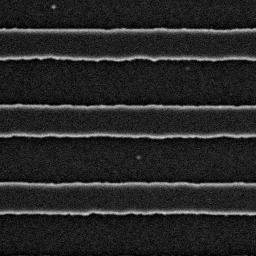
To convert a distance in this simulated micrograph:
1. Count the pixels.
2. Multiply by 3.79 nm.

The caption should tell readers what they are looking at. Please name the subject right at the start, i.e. lines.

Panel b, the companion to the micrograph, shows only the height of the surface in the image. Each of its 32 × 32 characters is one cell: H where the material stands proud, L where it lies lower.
LLLLLLLLLLLLLLLLLLLLLLLLLLLLLLLL
LLLLLLLLLLLLLLLLLLLLLLLLLLLLLLLL
LLLLLLLLLLLLLLLLLLLLLLLLLLLLLLLL
LLLLLLLLLLLLLLLLLLLLLLLLLLLLLLLL
HHHHHHHHHHHHHHHHHHHHHHHHHHHHHHHH
HHHHHHHHHHHHHHHHHHHHHHHHHHHHHHHH
HHHHHHHHHHHHHHHHHHHHHHHHHHHHHHHH
LLLLLLLLLLLLHLHLLLLHLLLLLLHLLLLL
LLLLLLLLLLLLLLLLLLLLLLLLLLLLLLLL
LLLLLLLLLLLLLLLLLLLLLLLLLLLLLLLL
LLLLLLLLLLLLLLLLLLLLLLLLLLLLLLLL
LLLLLLLLLLLLLLLLLLLLLLLLLLLLLLLL
LLLLLLLLLLLLLLLLLLLLLLLLLLLLLLLL
HHHHHHHHHHHHHHHHHHHHHHHHHHHHHHHH
HHHHHHHHHHHHHHHHHHHHHHHHHHHHHHHH
HHHHHHHHHHHHHHHHHHHHHHHHHHHHHHHH
HHHHHHHHHHHHHHHHHHHHHHHHHHHHHHHH
LLLLLLLLLLLLLLLLLLLLLLLLLLLLLLLL
LLLLLLLLLLLLLLLLLLLLLLLLLLLLLLLL
LLLLLLLLLLLLLLLLLLLLLLLLLLLLLLLL
LLLLLLLLLLLLLLLLLLLLLLLLLLLLLLLL
LLLLLLLLLLLLLLLLLLLLLLLLLLLLLLLL
LLLLLLLLLLLLLLLLLLLLLLLLLLLLLLLL
HHHHHHHHHHHHHHHHHHHHHHHHHHHHHHHH
HHHHHHHHHHHHHHHHHHHHHHHHHHHHHHHH
HHHHHHHHHHHHHHHHHHHHHHHHHHHHHHHH
HHHHHHHHHHHHHHHHHHHHHHHHHHHHHHHH
LLLLLLLLLLLLLLLLLLLLLLLLLLLLLLLL
LLLLLLLLLLLLLLLLLLLLLLLLLLLLLLLL
LLLLLLLLLLLLLLLLLLLLLLLLLLLLLLLL
LLLLLLLLLLLLLLLLLLLLLLLLLLLLLLLL
LLLLLLLLLLLLLLLLLLLLLLLLLLLLLLLL